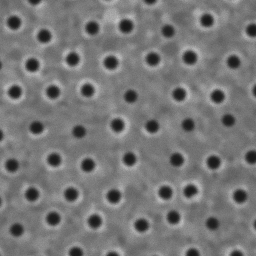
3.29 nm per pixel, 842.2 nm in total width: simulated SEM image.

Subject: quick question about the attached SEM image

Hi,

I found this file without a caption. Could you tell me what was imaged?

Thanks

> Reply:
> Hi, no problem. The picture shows a regular array of holes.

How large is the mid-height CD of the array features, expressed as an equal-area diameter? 0.0451 microns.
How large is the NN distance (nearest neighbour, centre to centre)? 33.4 pixels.